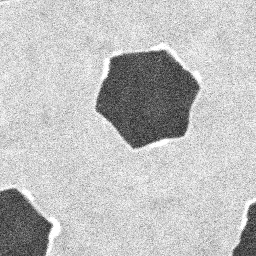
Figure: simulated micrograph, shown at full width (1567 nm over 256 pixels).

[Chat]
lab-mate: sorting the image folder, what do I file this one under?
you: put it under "holes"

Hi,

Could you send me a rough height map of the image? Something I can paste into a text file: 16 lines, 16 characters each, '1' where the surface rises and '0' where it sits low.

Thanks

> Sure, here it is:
1111111111111111
1111111111111111
1111111111111111
1111111000011111
1111111000001111
1111110000001111
1111110000001111
1111111000001111
1111111100011111
1111111111111111
1111111111111111
1111111111111111
0011111111111111
0001111111111110
0001111111111110
0001111111111110